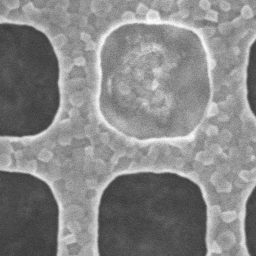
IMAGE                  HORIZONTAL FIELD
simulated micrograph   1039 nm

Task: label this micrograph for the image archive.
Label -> holes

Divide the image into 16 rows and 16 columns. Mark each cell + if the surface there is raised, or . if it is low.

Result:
++++++++++++++++
.+++++++++++++++
...+++++++++++++
....++++++++++++
....+++++++++++.
....+++++++++++.
....++++++++++++
...+++++++++++++
..++++++++++++++
++++++++++++++++
++++++++++++++++
...++++.....++++
....++.......++.
....++.......++.
....++.......++.
....++.......++.